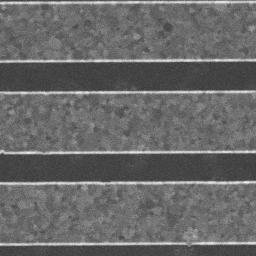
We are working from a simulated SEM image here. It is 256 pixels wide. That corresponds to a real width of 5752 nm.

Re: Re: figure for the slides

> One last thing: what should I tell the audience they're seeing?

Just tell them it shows one or a few lines or trenches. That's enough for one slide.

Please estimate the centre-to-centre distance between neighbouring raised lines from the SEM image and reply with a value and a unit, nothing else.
2.04 micrometres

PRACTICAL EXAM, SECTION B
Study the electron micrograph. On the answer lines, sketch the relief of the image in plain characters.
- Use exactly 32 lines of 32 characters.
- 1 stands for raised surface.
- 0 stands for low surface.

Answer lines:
11111111111111111111111111111111
11111111111111111111111111111111
11111111111111111111111111111111
11111111111111111111111111111111
11111111111111111111111111111111
11111111111111111111111111111111
11111111111111111111111111111111
11111111111111111111111111111110
00000000000000000000000000000000
00000000000000000000000000000000
00000000000000000000000000000000
00000000000000000000000000000001
11111111111111111111111111111111
11111111111111111111111111111111
11111111111111111111111111111111
11111111111111111111111111111111
11111111111111111111111111111111
11111111111111111111111111111111
11111111111111111111111111111111
00000000000000000000000000000000
00000000000000000000000000000000
00000000000000000000000000000000
00000000000000000000000000000000
11111111111111111111111111111111
11111111111111111111111111111111
11111111111111111111111111111111
11111111111111111111111111111111
11111111111111111111111111111111
11111111111111111111111111111111
11111111111111111111111111111111
00000000000000000000000100000000
00000000000000000000000000000000